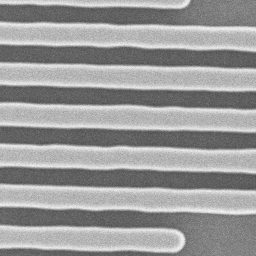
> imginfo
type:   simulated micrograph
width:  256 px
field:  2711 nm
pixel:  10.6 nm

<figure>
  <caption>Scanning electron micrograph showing groups of lines, slits or small figures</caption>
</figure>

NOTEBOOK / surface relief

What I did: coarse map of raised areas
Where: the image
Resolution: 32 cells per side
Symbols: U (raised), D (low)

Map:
DDDDUUUUUUUUUUUUUUUUUUUDDDDDDDDD
DDDDDDDDDDDDDDDDDDDDDDDDDDDDDDDD
DDDDDDDDDDDDDDDDDDDDDDDDDDDDDDDD
UUUUUUUUUUUUUUUUUUUUUUUUUUDDDDDD
UUUUUUUUUUUUUUUUUUUUUUUUUUUUUUUU
DUUUUUUUUUUUUUUUUUUUUUUUUUUUUUUU
DDDDDDDDDDDDDDDDDDDDDDDDDDDDDDDD
DDDDDDDDDDDDDDDDDDDDDDDDDDDDDDDD
UUUUUUUUUUUUUUUUUUUUUUUUUUUDDDDD
UUUUUUUUUUUUUUUUUUUUUUUUUUUUUUUU
UUUUUUUUUUUUUUUUUUUUUUUUUUUUUUUU
DDDDDDDDDDDDDDDDDDDDDDDDDDDDDDDD
DDDDDDDDDDDDDDDDDDDDDDDDDDDDDDDD
UUUUUUUUUUUUUUUUUUUUUUUDDDDDDDDD
UUUUUUUUUUUUUUUUUUUUUUUUUUUUUUUU
UUUUUUUUUUUUUUUUUUUUUUUUUUUUUUUU
DDDDDDDDDDDDDDDDDDDDDDDDDDDDDDDD
DDDDDDDDDDDDDDDDDDDDDDDDDDDDDDDD
UUUUUUUUUUUUUUUUUUUUUUDDDDDDDDDD
UUUUUUUUUUUUUUUUUUUUUUUUUUUUUUUU
UUUUUUUUUUUUUUUUUUUUUUUUUUUUUUUU
DDDDDDDDDDDDDDDDDDDDDDDDDDDDDDUU
DDDDDDDDDDDDDDDDDDDDDDDDDDDDDDDD
UUUUUUUUUUUUUUUDDDDDDDDDDDDDDDDD
UUUUUUUUUUUUUUUUUUUUUUUUUUUUUUUU
UUUUUUUUUUUUUUUUUUUUUUUUUUUUUUUU
DDDDDDDDDDDDDDDDDDDDDDDDDUUUUUUU
DDDDDDDDDDDDDDDDDDDDDDDDDDDDDDDD
UUUUUUUUUUUUUDDDDDDDDDDDDDDDDDDD
UUUUUUUUUUUUUUUUUUUUUUUDDDDDDDDD
UUUUUUUUUUUUUUUUUUUUUUUDDDDDDDDD
DDDDDDDDDDDDDDDDDDDDDDDDDDDDDDDD